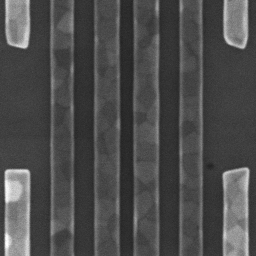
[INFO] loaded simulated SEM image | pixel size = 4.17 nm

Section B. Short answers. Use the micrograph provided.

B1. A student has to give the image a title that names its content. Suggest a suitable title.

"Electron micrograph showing wiring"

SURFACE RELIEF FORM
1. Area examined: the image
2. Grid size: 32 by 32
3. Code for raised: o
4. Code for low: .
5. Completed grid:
.ooo..ooo...ooo..ooo...oo...ooo.
.ooo..ooo...ooo..ooo...oo...ooo.
.ooo..ooo...ooo..ooo...oo...ooo.
.ooo..ooo...ooo..ooo...oo...ooo.
.ooo..ooo...ooo..ooo...oo...ooo.
.oo...ooo...ooo..ooo...oo....oo.
......ooo...ooo..ooo...oo.......
......ooo...ooo..ooo...oo.......
......ooo...ooo..ooo...oo.......
......ooo...ooo..ooo...oo.......
......ooo...ooo..ooo...oo.......
......ooo...ooo..ooo...oo.......
......ooo...ooo..ooo...oo.......
......ooo...ooo..ooo...oo.......
......ooo...ooo..ooo..ooo.......
......ooo...ooo..ooo..ooo.......
......ooo...ooo..ooo..ooo.......
......ooo...ooo..ooo..ooo.......
......ooo...ooo..ooo..ooo.......
......ooo...ooo..ooo..ooo.......
......ooo...ooo..ooo...oo.......
.ooo..ooo...ooo..ooo...oo...ooo.
.ooo..ooo...ooo..ooo...oo...ooo.
.ooo..ooo...ooo..ooo...oo...ooo.
.ooo..ooo...ooo..ooo...oo...ooo.
.ooo..ooo...ooo..ooo...oo...ooo.
.ooo..ooo...ooo..ooo..ooo...ooo.
.ooo..ooo...ooo..ooo..ooo...ooo.
.ooo..ooo...ooo..ooo..ooo...ooo.
.ooo..ooo...ooo..ooo..ooo...ooo.
.ooo..ooo...ooo..ooo..ooo...ooo.
.ooo..ooo...ooo..ooo..ooo...ooo.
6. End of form